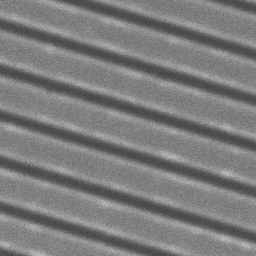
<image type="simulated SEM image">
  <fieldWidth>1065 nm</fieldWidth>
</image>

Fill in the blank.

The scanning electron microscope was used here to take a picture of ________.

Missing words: parallel lines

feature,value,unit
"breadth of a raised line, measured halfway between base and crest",126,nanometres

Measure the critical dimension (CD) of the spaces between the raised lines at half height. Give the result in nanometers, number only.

56.2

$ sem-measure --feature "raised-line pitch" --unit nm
182